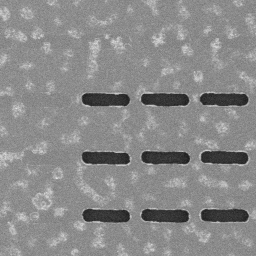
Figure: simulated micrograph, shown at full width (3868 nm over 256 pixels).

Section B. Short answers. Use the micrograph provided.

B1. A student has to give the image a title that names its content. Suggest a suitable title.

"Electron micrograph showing a regular array of holes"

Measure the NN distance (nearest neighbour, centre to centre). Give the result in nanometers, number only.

878